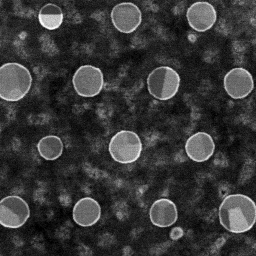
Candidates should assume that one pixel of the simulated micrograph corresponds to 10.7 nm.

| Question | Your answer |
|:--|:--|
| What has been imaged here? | a regular array of raised bodies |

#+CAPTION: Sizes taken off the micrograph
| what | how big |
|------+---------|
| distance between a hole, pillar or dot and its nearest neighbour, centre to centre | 791 nm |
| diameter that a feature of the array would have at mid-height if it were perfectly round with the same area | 0.305 micrometres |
